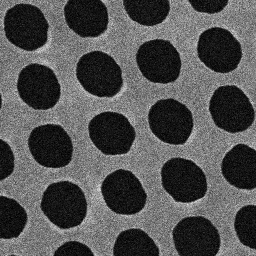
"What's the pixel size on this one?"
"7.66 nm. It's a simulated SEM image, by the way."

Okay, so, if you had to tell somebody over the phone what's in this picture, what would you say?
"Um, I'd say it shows a regular array of holes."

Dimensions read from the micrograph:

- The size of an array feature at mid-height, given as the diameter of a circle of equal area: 45.4 px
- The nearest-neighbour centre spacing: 60.3 pixels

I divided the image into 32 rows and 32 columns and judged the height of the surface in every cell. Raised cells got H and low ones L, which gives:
HHLHHHHHLLLLLHHLLLLLLHHHLLLLHHHH
HLLLLHHHLLLLLHHHLLLLLHHHHLLHHHHH
LLLLLLHHLLLLLLHHHLLLLHHHHHHHHHHH
LLLLLLHHHLLLLHHHHHHHHHHHHHLLHHHH
HLLLLLHHHHLLHHHHHHHHHHHHHLLLLHHH
HHLLLLHHHHHHHHHHHHLLLHHHHLLLLLHH
HHHHHHHHHHHLLHHHHLLLLLHHHLLLLLHH
HHHHHHHHHHLLLLHHHLLLLLLHHLLLLLHH
HHHLLLHHHHLLLLLHHLLLLLLHHHLLLHHH
HHLLLLLHHHLLLLLHHHLLLLHHHHHHHHHH
HHLLLLLHHHLLLLLHHHHHHHHHHHHHHHHH
HHLLLLLLHHHLLLLHHHHHHHHHHHHLLLHH
HHHLLLLHHHHHHHHHHHHHLLHHHHLLLLLH
HHHHLLHHHHHHHHHHHHHLLLLHHHLLLLLL
HHHHHHHHHHHHLLLLHHHLLLLLHHLLLLLL
HHHHHHHHHHHLLLLLHHHLLLLLHHHLLLLH
HHHHLLLLHHHLLLLLLHHLLLLLHHHHHLHH
HHHHLLLLLHHLLLLLLHHHLLLHHHHHHHHH
LHHHLLLLLHHHLLLLHHHHHHHHHHHHHLLH
LLHHLLLLLHHHHHHHHHHHHHHHHHHHLLLL
LLHHHLLLHHHHHHHHHHHHHLLLHHHHLLLL
LLHHHHHHHHHHHHLLHHHHLLLLLHHHLLLL
HHHHHHHHHHHHHLLLLHHHLLLLLLHHLLLL
HHHHHHLLLLHHHLLLLLHHLLLLLLHHHHLL
HHHHHLLLLLLHHLLLLLHHHLLLLHHHHHHH
LLHHHLLLLLLHHLLLLLHHHHHHHHHHHHHH
LLLHHLLLLLLHHHLLLHHHHHHHHHHHHHLL
LLLHHHLLLLHHHHHHHHHHHHHLLLHHHLLL
LLLHHHHHLHHHHHHHHHHHHHLLLLLHHLLL
LLHHHHHHHHHHHHHLLLLHHHLLLLLHHHLL
HHHHHHHHLLHHHHLLLLLHHHLLLLLLHHLL
HHHHHHHLLLLLHHLLLLLLHHLLLLLHHHHH